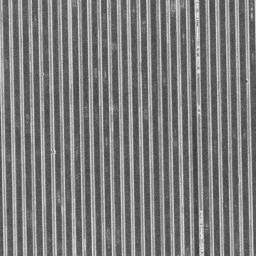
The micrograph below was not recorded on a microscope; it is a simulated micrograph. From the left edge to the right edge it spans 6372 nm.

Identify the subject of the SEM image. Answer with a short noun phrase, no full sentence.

parallel lines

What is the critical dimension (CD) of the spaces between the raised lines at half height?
0.168 µm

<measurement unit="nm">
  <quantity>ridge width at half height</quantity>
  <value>84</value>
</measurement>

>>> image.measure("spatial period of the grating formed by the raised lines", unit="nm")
245